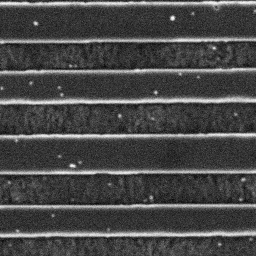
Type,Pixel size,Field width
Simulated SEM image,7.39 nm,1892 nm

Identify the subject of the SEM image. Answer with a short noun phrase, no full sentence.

lines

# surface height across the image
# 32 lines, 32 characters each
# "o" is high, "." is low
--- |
oooooooooooooooooooooooooooooooo
oooooooooooooooooooooooooooooooo
oooooooooooooooooooooooooooooooo
oooooooooooooooooooooooooooooooo
oooooooooooooooooooooooooooooooo
................................
................................
................................
................................
oooooooooooooooooooooooooooooooo
oooooooooooooooooooooooooooooooo
oooooooooooooooooooooooooooooooo
oooooooooooooooooooooooooooooooo
................................
................................
................................
................................
oooooooooooooooooooooooooooooooo
oooooooooooooooooooooooooooooooo
oooooooooooooooooooooooooooooooo
oooooooooooooooooooooooooooooooo
oooooooooooooooooooooooooooooooo
................................
................................
................................
................................
oooooooooooooooooooooooooooooooo
oooooooooooooooooooooooooooooooo
oooooooooooooooooooooooooooooooo
................................
................................
................................